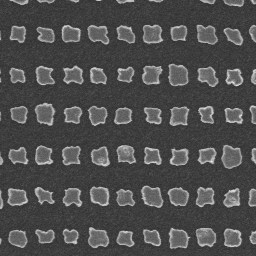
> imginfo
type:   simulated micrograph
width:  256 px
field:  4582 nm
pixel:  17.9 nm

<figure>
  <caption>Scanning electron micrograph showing a regular array of raised bodies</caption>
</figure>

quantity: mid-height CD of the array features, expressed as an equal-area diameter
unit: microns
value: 0.314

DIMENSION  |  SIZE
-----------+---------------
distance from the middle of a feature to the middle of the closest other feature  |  0.47 microns